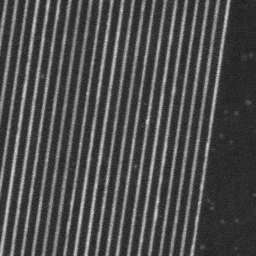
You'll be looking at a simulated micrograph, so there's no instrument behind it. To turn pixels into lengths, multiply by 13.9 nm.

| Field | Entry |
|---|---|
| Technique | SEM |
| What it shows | parallel lines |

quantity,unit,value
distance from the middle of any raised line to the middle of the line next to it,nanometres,146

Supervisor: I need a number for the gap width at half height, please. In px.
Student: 8.41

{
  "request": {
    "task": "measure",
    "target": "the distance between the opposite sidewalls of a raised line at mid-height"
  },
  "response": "27.5 nm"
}